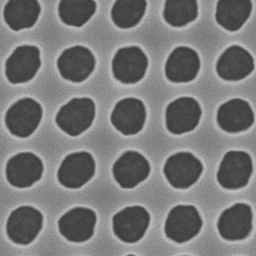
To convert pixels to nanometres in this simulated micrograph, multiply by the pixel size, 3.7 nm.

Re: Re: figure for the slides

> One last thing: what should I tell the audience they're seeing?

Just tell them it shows a regular array of holes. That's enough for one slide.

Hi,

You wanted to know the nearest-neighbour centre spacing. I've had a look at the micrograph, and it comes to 193 nm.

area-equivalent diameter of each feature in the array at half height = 139 nanometers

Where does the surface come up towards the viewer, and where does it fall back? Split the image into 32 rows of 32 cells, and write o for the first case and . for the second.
o....oo.....oo....ooo....oo.....
.....oo.....oo....oo.....oo....o
o....ooo...ooo....ooo...ooo....o
o..oooooooooooo.oooooooooooo..oo
oooooooooooooooooooooooooooooooo
oooooooooooooooooooooooooooooooo
oo...ooo...oooo...ooo...oooo...o
o....oo.....oo....ooo....oo.....
o....oo.....oo....ooo....oo.....
o...oooo...ooo....ooo....oo....o
oooooooooooooooooooooooooooooooo
oooooooooooooooooooooooooooooooo
oo..ooooo..oooo..ooooo..ooooo.oo
o....ooo....oo....ooo....oo....o
o....oo.....oo....ooo....oo.....
o....oo....ooo....ooo....oo.....
o...oooo..ooooo..oooo...oooo..oo
oooooooooooooooooooooooooooooooo
oooooooooooooooooooooooooooooooo
oo...ooo...oooo...ooo...oooo...o
o....ooo....oo.....oo....ooo....
o....oo.....oo.....o.....oo.....
o....oo....ooo....ooo....oo....o
oo.oooooo.ooooo..ooooo.ooooo..oo
oooooooooooooooooooooooooooooooo
ooooooooooooooooooooooooooooo..o
o....ooo....ooo...ooo....ooo...o
o....oo.....oo.....oo....oo.....
o....oo.....oo....ooo....oo.....
o....ooo...ooo....ooo...oooo...o
oo.ooooooooooooooooooooooooooooo
oooooooooooooooooooooooooooooooo